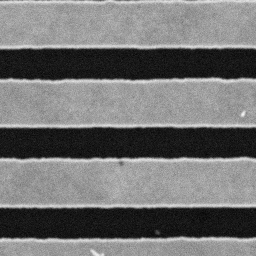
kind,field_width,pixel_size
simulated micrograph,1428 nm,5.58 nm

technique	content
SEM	lines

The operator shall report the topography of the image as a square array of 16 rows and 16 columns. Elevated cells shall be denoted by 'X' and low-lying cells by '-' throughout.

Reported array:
XXXXXXXXXXXXXXXX
XXXXXXXXXXXXXXXX
XXXXXXXXXXXXXXXX
----------------
----------------
XXXXXXXXXXXXXXXX
XXXXXXXXXXXXXXXX
XXXXXXXXXXXXXXXX
----------------
----------------
XXXXXXXXXXXXXXXX
XXXXXXXXXXXXXXXX
XXXXXXXXXXXXXXXX
----------------
----------------
XXXXXXXXXXXXXXXX